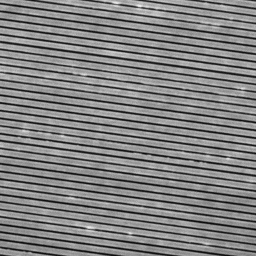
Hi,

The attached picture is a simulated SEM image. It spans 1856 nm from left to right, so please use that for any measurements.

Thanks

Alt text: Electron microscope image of parallel lines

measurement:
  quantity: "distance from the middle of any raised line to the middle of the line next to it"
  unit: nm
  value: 54.7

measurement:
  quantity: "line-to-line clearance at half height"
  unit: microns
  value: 0.0135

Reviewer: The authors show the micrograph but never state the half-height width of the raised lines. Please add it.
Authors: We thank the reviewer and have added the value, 41.3 nm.